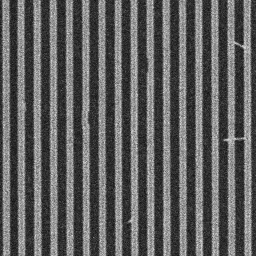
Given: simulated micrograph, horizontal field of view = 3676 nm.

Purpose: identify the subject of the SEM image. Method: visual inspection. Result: parallel lines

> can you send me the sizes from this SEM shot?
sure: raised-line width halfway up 75.4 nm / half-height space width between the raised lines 0.151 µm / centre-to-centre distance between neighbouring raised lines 231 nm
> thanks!